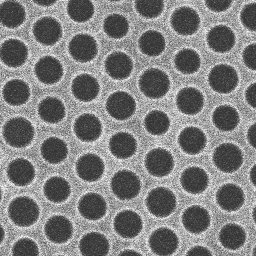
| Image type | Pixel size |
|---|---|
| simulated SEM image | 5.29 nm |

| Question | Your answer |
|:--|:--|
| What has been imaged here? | a regular array of holes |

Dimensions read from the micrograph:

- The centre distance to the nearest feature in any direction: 0.208 microns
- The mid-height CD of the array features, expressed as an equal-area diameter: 0.142 microns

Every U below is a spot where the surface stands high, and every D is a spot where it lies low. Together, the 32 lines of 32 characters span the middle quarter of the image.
UUUUUUUUUUDDDDDDDUUUUUUUUUUUDDDD
UUUUUUUUUUUDDDDDDUUUUDDDUUUUUDDD
UUUUUUUUUUUDDDDDUUUUDDDDDUUUUUUU
UUUDDDDUUUUUUDDUUUUDDDDDDDUUUUUU
UUDDDDDDUUUUUUUUUUUDDDDDDDUUUUUU
UUDDDDDDDUUUUUUUUUUDDDDDDDUUUUUU
UUDDDDDDDUUUUUUUUUUDDDDDDDUUUDDD
UUDDDDDDUUUUDDDDUUUUDDDDDUUUDDDD
UUUDDDDDUUUDDDDDDUUUUUDDUUUUDDDD
UUUUUUUUUUUDDDDDDDUUUUUUUUUUDDDD
UUUUUUUUUUUDDDDDDDUUUUUUUUUUDDDD
UUUUUUUUUUUDDDDDDDUUUUUUUUUUUDDD
UUUUUDUUUUUDDDDDDUUUUDDDDUUUUUUD
UUUDDDDDUUUUUDDDUUUUDDDDDDUUUUUU
UUUDDDDDDUUUUUUUUUUUDDDDDDUUUUUU
UUDDDDDDDUUUUUUUUUUUDDDDDDUUUUUU
UUUDDDDDDUUUUUUUUUUUUDDDDDUUUUDD
UUUDDDDDDUUUUDDDUUUUUUDDUUUUUDDD
UUUUDDDDUUUUDDDDDUUUUUUUUUUUUDDD
UUUUUUUUUUUDDDDDDDUUUUUUUUUUUDDD
DUUUUUUUUUUDDDDDDDUUUUUUUUUUUDDD
DUUUUUUUUUUUDDDDDDUUUUDDDUUUUUDD
DUUUUUDUUUUUDDDDDUUUUDDDDDUUUUUU
UUUUDDDDDUUUUUDUUUUUUDDDDDDUUUUU
UUUDDDDDDDUUUUUUUUUUDDDDDDDUUUUU
UUUDDDDDDDUUUUUUUUUUDDDDDDDUUUUU
UUUDDDDDDDUUUUUUUUUUUDDDDDDUUUDD
UUUUDDDDDDUUUDDDDUUUUUDDDDUUUUDD
UUUUDDDDDUUUDDDDDDUUUUUUUUUUUDDD
DUUUUUUUUUUUDDDDDDDUUUUUUUUUUDDD
DUUUUUUUUUUUDDDDDDDUUUUUUUUUUUDD
DUUUUUUUUUUUDDDDDDDUUUDDDDUUUUDD